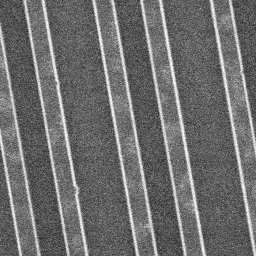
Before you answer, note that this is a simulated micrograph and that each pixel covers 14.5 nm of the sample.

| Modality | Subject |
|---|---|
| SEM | parallel lines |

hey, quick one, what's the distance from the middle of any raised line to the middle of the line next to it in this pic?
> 842 nm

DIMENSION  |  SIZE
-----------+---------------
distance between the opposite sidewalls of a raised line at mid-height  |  267 nm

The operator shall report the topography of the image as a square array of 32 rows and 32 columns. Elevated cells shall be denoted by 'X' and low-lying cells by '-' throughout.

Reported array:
---XX-------XX----XX------XXX---
---XXX------XX----XX-------XX---
----XX------XXX---XX-------XX---
----XX------XXX---XXX------XX---
----XX-------XX---XXX------XX---
----XX-------XX----XX------XXX--
----XX-------XX----XX------XXX--
X---XXX------XX----XX-------XX--
X----XX------XXX---XXX------XX--
X----XX------XXX---XXX------XX--
X----XX-------XX----XX------XXX-
X----XX-------XX----XX------XXX-
XX---XX-------XX----XX-------XX-
XX---XXX------XX----XX-------XX-
XX----XX------XXX---XXX------XX-
XX----XX------XXX---XXX------XX-
XX----XX-------XX----XX------XXX
XX----XX-------XX----XX------XXX
XXX---XX-------XX----XX-------XX
XXX---XXX------XX----XX-------XX
-XX----XX------XXX---XXX------XX
-XX----XX------XXX---XXX------XX
-XX----XX-------XX----XX------XX
-XX----XXX------XX----XX------XX
-XXX---XXX------XX----XX-------X
-XXX---XXX------XX----XX-------X
--XX----XX------XXX---XXX------X
--XX----XX------XXX---XXX------X
--XX----XX-------XX----XX------X
--XXX---XX-------XX----XX------X
--XXX---XXX------XX----XX-------
---XX----XX------XX----XX-------